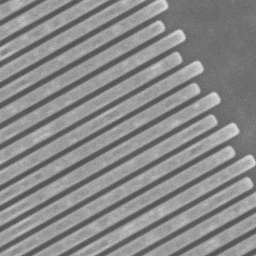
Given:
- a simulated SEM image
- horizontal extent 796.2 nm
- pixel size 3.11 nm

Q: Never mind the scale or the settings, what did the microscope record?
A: parallel lines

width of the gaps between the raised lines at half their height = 18.7 nm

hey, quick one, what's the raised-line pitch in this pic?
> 18 px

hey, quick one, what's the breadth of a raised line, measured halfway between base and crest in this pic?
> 37.3 nanometers